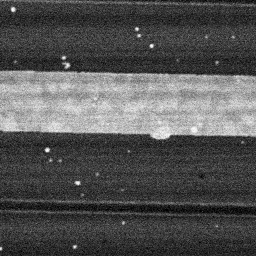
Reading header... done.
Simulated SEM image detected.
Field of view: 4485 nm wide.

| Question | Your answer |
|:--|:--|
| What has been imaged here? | lines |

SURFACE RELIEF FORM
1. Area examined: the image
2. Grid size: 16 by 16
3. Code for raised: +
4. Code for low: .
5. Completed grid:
................
................
................
................
................
++++++++++++++++
++++++++++++++++
++++++++++++++++
.........++.....
................
................
................
................
................
................
................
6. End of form